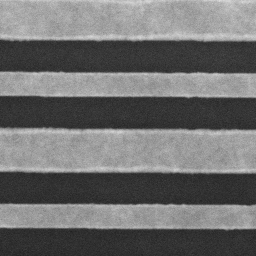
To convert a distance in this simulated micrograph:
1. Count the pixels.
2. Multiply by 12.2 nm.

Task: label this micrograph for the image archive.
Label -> lines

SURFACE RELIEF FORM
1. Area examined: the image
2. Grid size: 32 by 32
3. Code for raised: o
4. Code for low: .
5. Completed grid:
oooooooooooooooooooooooooooooooo
oooooooooooooooooooooooooooooooo
oooooooooooooooooooooooooooooooo
oooooooooooooooooooooooooooooooo
oooooooooooooooooooooooooooooooo
................................
................................
................................
................................
oooooooooooooooooooooooooooooooo
oooooooooooooooooooooooooooooooo
oooooooooooooooooooooooooooooooo
................................
................................
................................
................................
oooooooooooooooooooooooooooooooo
oooooooooooooooooooooooooooooooo
oooooooooooooooooooooooooooooooo
oooooooooooooooooooooooooooooooo
oooooooooooooooooooooooooooooooo
.....................ooooooooooo
................................
................................
................................
................................
oooooooooooooooooooooooooooooooo
oooooooooooooooooooooooooooooooo
............oooooooooooooooooooo
................................
................................
................................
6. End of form